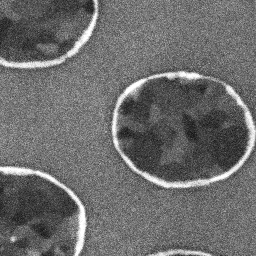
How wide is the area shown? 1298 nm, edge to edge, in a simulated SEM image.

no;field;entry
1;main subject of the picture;raised bodies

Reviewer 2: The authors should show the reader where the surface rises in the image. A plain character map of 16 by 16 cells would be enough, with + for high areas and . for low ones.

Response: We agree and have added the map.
++++++..........
++++++..........
+++++...........
++++............
................
........++++++..
.......++++++++.
.......+++++++++
.......+++++++++
.......+++++++++
........+++++++.
++++......+++...
+++++...........
+++++...........
+++++...........
+++++...........